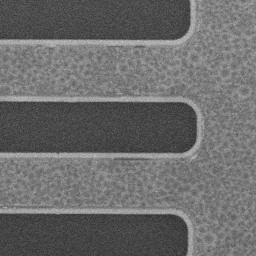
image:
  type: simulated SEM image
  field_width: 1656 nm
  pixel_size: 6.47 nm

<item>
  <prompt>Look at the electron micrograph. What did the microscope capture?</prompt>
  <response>one or a few lines or trenches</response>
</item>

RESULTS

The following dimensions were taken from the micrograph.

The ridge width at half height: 369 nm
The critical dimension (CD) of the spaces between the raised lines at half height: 0.364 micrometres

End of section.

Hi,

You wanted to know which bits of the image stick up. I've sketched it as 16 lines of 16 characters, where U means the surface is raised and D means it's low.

DDDDDDDDDDDDUUUU
DDDDDDDDDDDDUUUU
DDDDDDDDDDDUUUUU
UUUUUUUUUUUUUUUU
UUUUUUUUUUUUUUUU
UUUUUUUUUUUUUUUU
DDDDDDDDDDDDUUUU
DDDDDDDDDDDDUUUU
DDDDDDDDDDDDUUUU
DDDDDDDDDDDDUUUU
UUUUUUUUUUUUUUUU
UUUUUUUUUUUUUUUU
UUUUUUUUUUUUUUUU
DDDDDDDDDDDUUUUU
DDDDDDDDDDDDUUUU
DDDDDDDDDDDDUUUU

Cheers